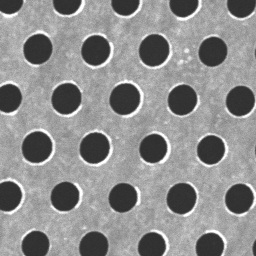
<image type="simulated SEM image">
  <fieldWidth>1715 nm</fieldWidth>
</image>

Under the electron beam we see a regular array of holes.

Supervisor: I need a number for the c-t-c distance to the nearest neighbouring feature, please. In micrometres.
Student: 0.38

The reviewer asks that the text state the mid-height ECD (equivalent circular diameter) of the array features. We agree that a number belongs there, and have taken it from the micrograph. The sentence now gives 201 nanometres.